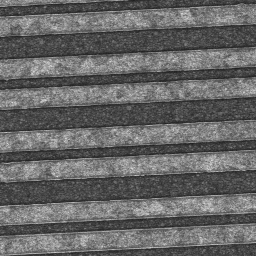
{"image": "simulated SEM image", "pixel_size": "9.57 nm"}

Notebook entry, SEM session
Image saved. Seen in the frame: parallel lines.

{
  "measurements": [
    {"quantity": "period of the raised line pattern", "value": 349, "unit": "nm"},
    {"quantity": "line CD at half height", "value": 184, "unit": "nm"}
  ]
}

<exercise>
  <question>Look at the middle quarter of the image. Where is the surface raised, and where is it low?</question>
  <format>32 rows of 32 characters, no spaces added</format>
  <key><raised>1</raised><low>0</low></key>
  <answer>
11111111111111111111111111111111
11111111111111111111111111110000
11111111000000000000000000000000
00000000000000000000000000000000
00000000000000000000000000011111
00000001111111111111111111111111
11111111111111111111111111111111
11111111111111111111111111111111
11111111111111111111111111111111
11111111111111111110000000000000
00000000000000000000000000000000
00000000000000000000000000000000
00000000000000000000000000000000
00000000000000000000000000000000
00000000000000000000000000000000
00000000000000000000111111111111
11111111111111111111111111111111
11111111111111111111111111111111
11111111111111111111111111111111
11111111111111111111111111111111
11111111111110000000000000000000
00000000000000000000000000000000
00000000000000000000000000000001
00000000000111111111111111111111
11111111111111111111111111111111
11111111111111111111111111111111
11111111111111111111111111111111
11111111111111111111111000000000
11100000000000000000000000000000
00000000000000000000000000000000
00000000000000000000000000000000
00000000000000000000000000000000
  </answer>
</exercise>